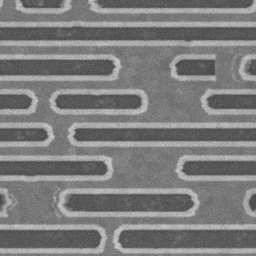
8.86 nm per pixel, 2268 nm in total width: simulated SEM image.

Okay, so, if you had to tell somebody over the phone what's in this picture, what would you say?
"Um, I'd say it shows parallel lines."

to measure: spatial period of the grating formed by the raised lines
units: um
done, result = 0.3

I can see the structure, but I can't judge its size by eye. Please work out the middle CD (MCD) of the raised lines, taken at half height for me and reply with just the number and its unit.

121 nm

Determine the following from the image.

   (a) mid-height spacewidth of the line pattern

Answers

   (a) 20.4 px